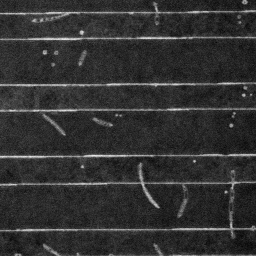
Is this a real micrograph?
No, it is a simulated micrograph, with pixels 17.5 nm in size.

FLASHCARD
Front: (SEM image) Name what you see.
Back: lines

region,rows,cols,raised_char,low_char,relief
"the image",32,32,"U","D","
DDDDDDDDDDDDDDDDDDDDDDDDDDDDDDDD
DDDDDDDDDDDDDDDDDDDUDDDDDDDDDDUU
UUUUUUUUUUUUUUUUUUUUUUUUUUUUUUUU
UUUUUUUUUUUUUUUUUUUUUUUUUUUUUUUU
UUUUUUUUUUUUUUUUUUUUUUUUUUUUUUUU
DDDDDDDDDDDDDDDDDDDDDDDDDDDDDDDD
DDDDDDDDDDDDDDDDDDDDDDDDDDDDDDDD
DDDDDDDDDDDDDDDDDDDDDDDDDDDDDDDD
DDDDDDDDDDDDDDDDDDDDDDDDDDDDDDDD
DDDDDDDDDDDDDDDDDDDDDDDDDDDDDDDD
DDDDDDDDDDDDDDDDDDDUDDDDDDDUUUUU
UUUUUUUUUUUUUUUUUUUUUUUUUUUUUUUU
UUUUUUUUUUUUUUUUUUUUUUUUUUUUUUUU
UUUUUUUUUUUUUUUUUUUUUUUUUUUUUUUU
DDDDDDDDDDDDDDDDDDDDDDDDDDDDDDDD
DDDDDDDDDDDDDDDDDDDDDDDDDDDDDDDD
DDDDDDDDDDDDDDDDDDDDDDDDDDDDDDDD
DDDDDDDDDDDDDDDDDDDDDDDDDDDDDDDD
DDDDDDDDDDDDDDDDDDDDDDDDDDDDDDDD
DDDDDDDDDDUUUUUUUUUUUUUUUUUUUUUU
UUUUUUUUUUUUUUUUUUUUUUUUUUUUUUUU
UUUUUUUUUUUUUUUUUUUUUUUUUUUUUUUU
UUUUUUUUUUUUUUUUUUUUUUUUUUUUUUUU
DDDDDDDDDDDDDDDDDDDDDDDDDDDDDDDD
DDDDDDDDDDDDDDDDDDDDDDDDDDDDDDDD
DDDDDDDDDDDDDDDDDDDDDDDDDDDDDDDD
DDDDDDDDDDDDDDDDDDDDDDDDDDDDDDDD
DDDDDDDDDDDDDDDDDDDDDDDDDDDDDDDD
DDDDDDDDDDDDDDDDDDDDDDDDDDDDDDDU
UUUUUUUUUUUUUUUUUUUUUUUUUUUUUUUU
UUUUUUUUUUUUUUUUUUUUUUUUUUUUUUUU
UUUUUUUUUUUUUUUUUUUUUUUUUUUUUUUU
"